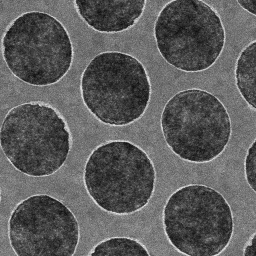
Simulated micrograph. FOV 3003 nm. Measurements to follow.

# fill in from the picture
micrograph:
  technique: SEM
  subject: holes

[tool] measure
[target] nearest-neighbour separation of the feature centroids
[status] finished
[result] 87.9 px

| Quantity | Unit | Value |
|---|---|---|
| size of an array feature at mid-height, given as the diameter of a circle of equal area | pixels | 70.5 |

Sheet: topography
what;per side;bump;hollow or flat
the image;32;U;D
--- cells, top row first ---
UUUUUUUUUUDDDDDDDDUUUDDDDDUUUUDD
UUUUDUUUUUDDDDDDDDUUDDDDDDDUUUUD
UUDDDDDUUUUDDDDDDUUUDDDDDDDDUUUU
UDDDDDDDUUUUDDDDUUUDDDDDDDDDUUUU
UDDDDDDDDUUUUUUUUUUDDDDDDDDDUUUU
DDDDDDDDDUUUUUUUUUUUDDDDDDDDUUUD
UDDDDDDDDUUUUUUUUUUUDDDDDDDDUUDD
UDDDDDDDDUUUDDDDDUUUUDDDDDDUUUDD
UDDDDDDDDUUDDDDDDDUUUUDDDDUUUUDD
UUDDDDDDUUDDDDDDDDUUUUUUUUUUUUDD
UUUUDDUUUUDDDDDDDDDUUUUUUUUUUUDD
UUUUUUUUUUDDDDDDDDDUUUUDDDUUUUDD
UUUUUUUUUUDDDDDDDDDUUDDDDDDUUUUD
UUDDDDUUUUUDDDDDDDUUUDDDDDDDUUUU
UDDDDDDUUUUUDDDDDUUUDDDDDDDDDUUU
DDDDDDDDUUUUUUDDUUUUDDDDDDDDDUUU
DDDDDDDDUUUUUUUUUUUUDDDDDDDDDUUU
DDDDDDDDDUUUUUUUUUUUUDDDDDDDDUUU
DDDDDDDDDUUUDDDDDUUUUDDDDDDDUUUD
UDDDDDDDUUUDDDDDDDUUUUUDDDDUUUUD
UUDDDDDDUUUDDDDDDDDUUUUUUUUUUUUD
UUUDDDDUUUUDDDDDDDDUUUUUUUUUUUUD
UUUUUUUUUUUDDDDDDDDUUUUUUUUUUUUD
UUUUUUUUUUUDDDDDDDDUUUUDDDUUUUUD
UUUUDDUUUUUDDDDDDDDUUDDDDDDDUUUU
UUUDDDDDUUUUDDDDDDUUUDDDDDDDUUUU
UUDDDDDDDUUUUUDDUUUUUDDDDDDDDUUU
UDDDDDDDDUUUUUUUUUUUUDDDDDDDDUUU
UDDDDDDDDDUUUUUUUUUUUDDDDDDDDUUU
UDDDDDDDDDUUUUUUUUUUUDDDDDDDDUUU
UDDDDDDDDDUUDDDDDUUUUUDDDDDDUUUD
UUDDDDDDDUUUDDDDDDUUUUUDDDDDUUUD